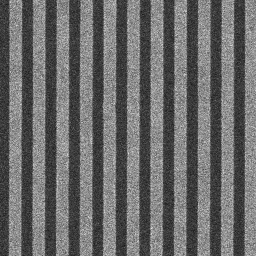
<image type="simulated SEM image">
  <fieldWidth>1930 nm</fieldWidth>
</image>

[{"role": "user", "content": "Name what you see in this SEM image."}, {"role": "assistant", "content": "parallel lines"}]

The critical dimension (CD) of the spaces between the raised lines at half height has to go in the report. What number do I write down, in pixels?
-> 11.9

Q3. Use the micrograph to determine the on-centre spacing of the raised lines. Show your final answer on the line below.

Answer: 178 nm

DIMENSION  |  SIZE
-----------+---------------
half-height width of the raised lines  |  89.5 nm